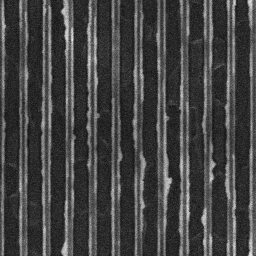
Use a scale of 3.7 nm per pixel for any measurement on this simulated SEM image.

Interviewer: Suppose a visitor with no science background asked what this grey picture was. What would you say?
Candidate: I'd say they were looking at parallel lines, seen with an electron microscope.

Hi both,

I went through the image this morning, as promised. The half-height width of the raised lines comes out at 8.27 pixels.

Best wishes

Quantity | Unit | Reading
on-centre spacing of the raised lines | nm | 85.5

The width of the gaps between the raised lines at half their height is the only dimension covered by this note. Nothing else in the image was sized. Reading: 54.2 nanometres